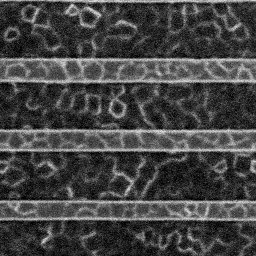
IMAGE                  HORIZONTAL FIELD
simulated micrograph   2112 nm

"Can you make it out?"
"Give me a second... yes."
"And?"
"one or a few lines or trenches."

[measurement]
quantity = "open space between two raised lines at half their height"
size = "425 nm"